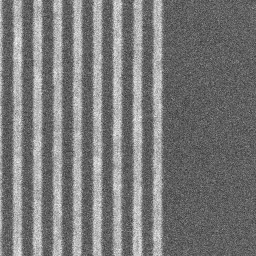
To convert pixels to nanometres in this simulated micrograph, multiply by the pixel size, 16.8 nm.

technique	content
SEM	parallel lines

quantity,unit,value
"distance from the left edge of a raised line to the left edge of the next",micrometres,0.336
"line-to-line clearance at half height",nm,225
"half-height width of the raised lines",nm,114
